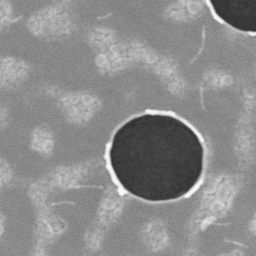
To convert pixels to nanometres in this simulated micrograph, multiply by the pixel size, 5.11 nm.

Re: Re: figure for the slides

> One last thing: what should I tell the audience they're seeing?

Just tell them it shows holes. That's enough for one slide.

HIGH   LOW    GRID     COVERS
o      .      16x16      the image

ooooooooooooo...
oooooooooooooo..
oooooooooooooooo
oooooooooooooooo
oooooooooooooooo
oooooooooooooooo
oooooooooooooooo
oooooooo...ooooo
ooooooo.....oooo
ooooooo......ooo
ooooooo......ooo
oooooooo....oooo
ooooooooo.oooooo
oooooooooooooooo
oooooooooooooooo
oooooooooooooooo